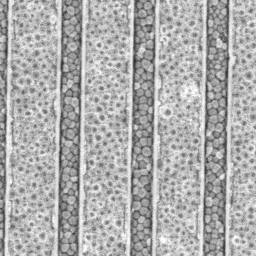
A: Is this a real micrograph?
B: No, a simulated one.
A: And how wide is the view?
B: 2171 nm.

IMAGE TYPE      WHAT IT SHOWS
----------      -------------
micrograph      one or a few lines or trenches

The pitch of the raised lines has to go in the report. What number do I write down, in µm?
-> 0.621